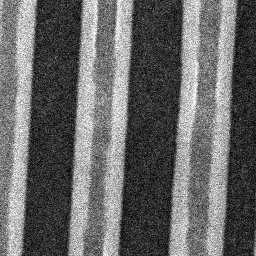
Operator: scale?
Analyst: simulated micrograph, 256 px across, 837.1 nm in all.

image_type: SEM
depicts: one or a few lines or trenches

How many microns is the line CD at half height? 0.116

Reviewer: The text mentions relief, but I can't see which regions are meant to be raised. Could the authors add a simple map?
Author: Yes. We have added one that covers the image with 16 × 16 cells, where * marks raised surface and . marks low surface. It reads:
**....**....**..
**....**....**..
**...***....**..
**...***....**..
**...***....**..
*....***....**..
*....**.....**..
*....**.....**..
*....**.....**..
*....**....***..
*....**....***..
*....**....***..
*....**....***..
*....**....***..
*....**....**...
*....**....**...